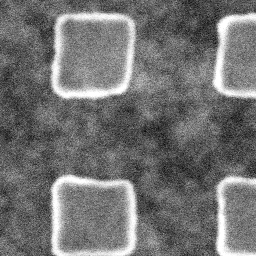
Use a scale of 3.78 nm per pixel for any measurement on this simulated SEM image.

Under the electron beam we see raised bodies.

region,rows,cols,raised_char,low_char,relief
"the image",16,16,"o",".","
................
....oooo......oo
....oooo......oo
...ooooo......oo
...ooooo.....ooo
...ooooo......oo
................
................
................
................
................
....oooo......oo
...ooooo......oo
...ooooo......oo
...ooooo......oo
...ooooo......oo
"